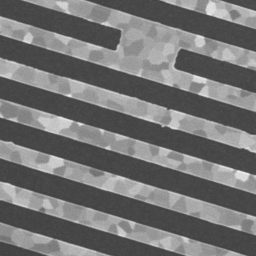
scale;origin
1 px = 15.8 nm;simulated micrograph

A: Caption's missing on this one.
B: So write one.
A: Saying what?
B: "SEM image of parallel lines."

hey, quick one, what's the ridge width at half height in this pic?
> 256 nanometres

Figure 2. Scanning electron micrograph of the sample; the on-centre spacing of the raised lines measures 621 nm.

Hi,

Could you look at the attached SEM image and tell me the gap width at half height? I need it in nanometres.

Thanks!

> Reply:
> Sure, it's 362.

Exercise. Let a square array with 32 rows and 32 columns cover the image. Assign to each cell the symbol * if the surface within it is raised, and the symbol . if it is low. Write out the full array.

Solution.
.....*******..........*******...
........*******..........*******
*..........*******..........****
****..........********..........
.*******.......**********.......
....*******....*************....
.......***************..********
*..........***********......****
****..........********.........*
*******..........*******........
...********..........*******....
.......*******..........*******.
..........*******..........*****
****..........*******..........*
*******..........*******........
...*******..........*******.....
.......*******..........*******.
..........*******..........*****
***..........*******...........*
******..........********........
...*******..........*******.....
......*******..........*******..
.........*******..........******
**..........********..........**
******..........*******.........
..*******..........*******......
.....********..........*******..
.........*******..........******
**..........*******..........***
*****..........********.........
.********..........*******......
.....*******..........*******...